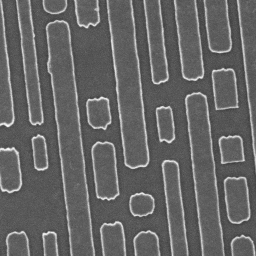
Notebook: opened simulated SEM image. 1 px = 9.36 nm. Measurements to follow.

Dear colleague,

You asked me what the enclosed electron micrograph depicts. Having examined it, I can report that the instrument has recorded parallel lines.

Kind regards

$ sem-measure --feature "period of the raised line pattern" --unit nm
299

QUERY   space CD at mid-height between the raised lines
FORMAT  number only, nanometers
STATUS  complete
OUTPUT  120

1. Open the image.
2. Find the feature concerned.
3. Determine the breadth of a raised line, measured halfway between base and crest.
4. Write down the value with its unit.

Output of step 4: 0.198 µm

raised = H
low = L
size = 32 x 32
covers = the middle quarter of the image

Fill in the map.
HHLLLLLLLLLLLHHHHHHLLLHHHHLLLHHH
HHLLLLLLLLLLLHHHHHHLLLHHHHLLLLHH
HHLLLLLLLLLLLHHHHHHLLLHHHHLLLLHH
HHHLLLLLLLLLLHHHHHHLLLHHHHLLLLHH
HHHLLLLLLLLLLHHHHHHLLLHHLLLLLLLL
HHHLLLLLLLLLLHHHHHHLLLLLLLLLLLLL
HHHLLLLLLLLLLHHHHHHLLLLLLLLLLLLL
HHHLLLLLLLLLLHHHHHHLLLLLLLLLLLLL
HHHLLLLLLLLLLLHHHHHLLLLLLLLLLLLH
HHHLLLHHHHHLLLHHHHHLLLLLLLLLLLHH
HHHLLLHHHHHLLLHHHHHHLLLLLLLLLLLH
HHHLLLHHHHHLLLHHHHHHLLLHHHHLLLLH
HHHLLLHHHHHLLLHHHHHHLLLHHHHLLLLH
HHHHLLHHHHHHLLHHHHHHLLLHHHHLLLLH
HHHHLLHHHHHHLLHHHHHHLLLHHHHLLLLH
HHHHLLLHHHHLLLHHHHHHLLLLHHHLLLLH
HHHHLLLLLLLLLLHHHHHHLLLLHHHHLLLH
HHHHLLLLLLLLLLLHHHHHLLLLHHHHLLLH
HHHHLLLLLLLLLLLHHHHHLLLLHHHHLLLH
HHHHLLLLLLLLLLLHHHHHHLLLLLLLLLLL
HHHHLLLLHHHHLLLHHHHHHLLLLLLLLLLL
HHHHLLLHHHHHHLLHHHHHHLLLLLLLLLLL
HHHHHLLHHHHHHLLHHHHHHLLLLLLLLLLL
HHHHHLLHHHHHHLLHHHHHHLLLLLLLLLLL
HHHHHLLHHHHHHLLHHHHHHLLLLHHHLLLL
HHHHHLLHHHHHHLLLHHHHLLLLLHHHHLLL
HHHHHLLLHHHHHLLLLLLLLLLLLHHHHLLL
HHHHHLLLHHHHHLLLLLLLLLLLLHHHHLLL
HHHHHLLLHHHHHLLLLLLLLLLLLHHHHLLL
HHHHHLLLHHHHHLLLLLLLLLLLLHHHHLLL
HHHHHLLLHHHHHLLLLLLLLLLLLHHHHLLL
HHHHHHLLHHHHHLLLLLLLLLLLLHHHHLLL